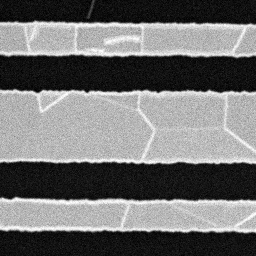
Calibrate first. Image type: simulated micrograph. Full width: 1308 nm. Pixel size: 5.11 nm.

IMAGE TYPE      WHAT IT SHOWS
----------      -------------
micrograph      lines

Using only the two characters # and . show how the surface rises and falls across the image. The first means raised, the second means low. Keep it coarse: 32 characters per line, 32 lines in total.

................................
................................
................................
################################
################################
################################
################################
................................
................................
................................
................................
####.########...###.#####.#.#.#.
################################
################################
################################
################################
################################
################################
################################
################################
................................
................................
................................
................................
................................
################################
################################
################################
################################
................................
................................
................................